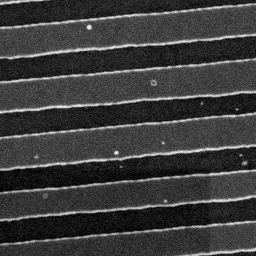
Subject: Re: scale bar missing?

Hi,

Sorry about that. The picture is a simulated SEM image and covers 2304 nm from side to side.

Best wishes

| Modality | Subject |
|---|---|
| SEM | lines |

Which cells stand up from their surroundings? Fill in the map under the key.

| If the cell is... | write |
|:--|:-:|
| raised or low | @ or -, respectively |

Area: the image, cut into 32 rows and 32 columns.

@-------------------------------
---------------------@@@@@@@@@@@
----------@@@@@@@@@@@@@@@@@@@@@@
@@@@@@@@@@@@@@@@@@@@@@@@@@@@@@@@
@@@@@@@@@@@@@@@@@@@@@@@@@@@@@@@-
@@@@@@@@@@@@@@@@@@@@@-----------
@@@@@@@@@-----------------------
------------------------------@@
-------------------@@@@@@@@@@@@@
---------@@@@@@@@@@@@@@@@@@@@@@@
@@@@@@@@@@@@@@@@@@@@@@@@@@@@@@@@
@@@@@@@@@@@@@@@@@@@@@@@@@@@@@@@@
@@@@@@@@@@@@@@@@@@--------------
@@@@@@@-------------------------
----------------------------@@@@
------------------@@@@@@@@@@@@@@
-------@@@@@@@@@@@@@@@@@@@@@@@@@
@@@@@@@@@@@@@@@@@@@@@@@@@@@@@@@@
@@@@@@@@@@@@@@@@@@@@@@@@@@@@----
@@@@@@@@@@@@@@@@@@--------------
@@@@@@@@------------------------
----------------------------@@@@
------------------@@@@@@@@@@@@@@
-------@@@@@@@@@@@@@@@@@@@@@@@@@
@@@@@@@@@@@@@@@@@@@@@@@@@@@@@@@@
@@@@@@@@@@@@@@@@@@@@@@@---------
@@@@@@@@@@@@--------------------
@-------------------------------
----------------------@@@@@@@@@@
-----------@@@@@@@@@@@@@@@@@@@@@
@@@@@@@@@@@@@@@@@@@@@@@@@@@@@@@@
@@@@@@@@@@@@@@@@@@@@@@@@@@@@@---